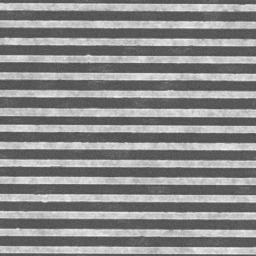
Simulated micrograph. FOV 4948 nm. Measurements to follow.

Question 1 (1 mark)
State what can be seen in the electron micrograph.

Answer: parallel lines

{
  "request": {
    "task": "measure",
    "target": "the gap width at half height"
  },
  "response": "215 nanometres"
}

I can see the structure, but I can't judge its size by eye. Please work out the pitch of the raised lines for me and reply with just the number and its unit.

335 nm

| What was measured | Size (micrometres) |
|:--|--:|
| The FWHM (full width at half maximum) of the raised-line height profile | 0.116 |